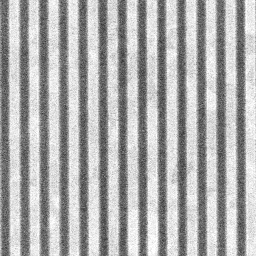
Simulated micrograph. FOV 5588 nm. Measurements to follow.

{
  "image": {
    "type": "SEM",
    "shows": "parallel lines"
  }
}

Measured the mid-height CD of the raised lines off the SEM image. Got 226 nm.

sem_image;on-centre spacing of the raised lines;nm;430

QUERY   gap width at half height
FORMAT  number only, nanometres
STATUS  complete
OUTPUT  210